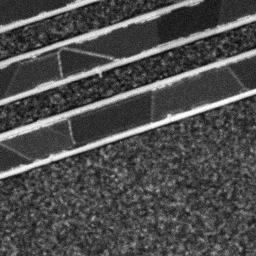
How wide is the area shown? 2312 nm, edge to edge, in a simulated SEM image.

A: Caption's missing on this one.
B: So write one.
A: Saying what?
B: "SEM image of one or a few lines or trenches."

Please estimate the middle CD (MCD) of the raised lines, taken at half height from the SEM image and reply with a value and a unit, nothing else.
345 nm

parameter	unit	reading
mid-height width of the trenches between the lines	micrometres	0.285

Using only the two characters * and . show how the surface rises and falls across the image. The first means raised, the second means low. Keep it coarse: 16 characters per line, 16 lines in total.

****.......*****
*.......*******.
.....*******....
..*******......*
******......****
***......*******
......********..
...********.....
********........
*****...........
**..............
................
................
................
................
................